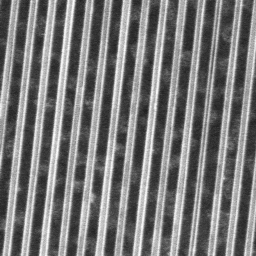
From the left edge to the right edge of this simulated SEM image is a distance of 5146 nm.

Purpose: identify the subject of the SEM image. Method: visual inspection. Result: parallel lines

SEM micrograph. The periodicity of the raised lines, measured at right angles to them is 372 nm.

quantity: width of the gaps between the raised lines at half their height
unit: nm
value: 102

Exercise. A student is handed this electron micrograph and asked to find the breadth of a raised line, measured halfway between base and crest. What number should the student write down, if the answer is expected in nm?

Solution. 275